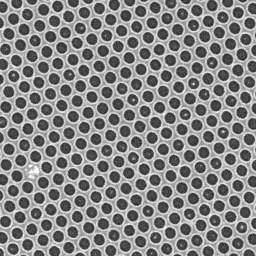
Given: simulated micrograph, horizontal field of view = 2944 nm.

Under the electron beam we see a regular array of holes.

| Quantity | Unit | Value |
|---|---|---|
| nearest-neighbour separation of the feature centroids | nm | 174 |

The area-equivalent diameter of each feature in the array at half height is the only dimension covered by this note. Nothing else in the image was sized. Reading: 141 nm